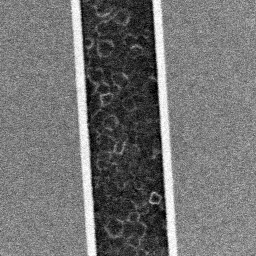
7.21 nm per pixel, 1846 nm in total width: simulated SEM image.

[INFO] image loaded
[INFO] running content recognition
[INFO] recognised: one or a few lines or trenches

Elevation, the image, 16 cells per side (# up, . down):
#####.....######
#####.....######
#####.....######
#####.....######
#####.....######
#####.....######
#####.....######
#####.....######
#####.....######
#####.....######
#####.....######
#####......#####
######.....#####
######.....#####
######.....#####
######.....#####